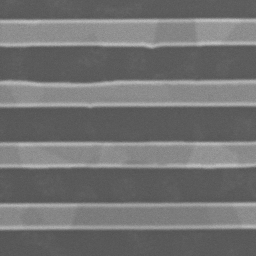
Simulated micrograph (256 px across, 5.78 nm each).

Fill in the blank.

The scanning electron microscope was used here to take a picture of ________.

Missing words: one or a few lines or trenches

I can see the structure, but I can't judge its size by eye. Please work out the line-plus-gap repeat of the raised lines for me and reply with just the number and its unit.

354 nm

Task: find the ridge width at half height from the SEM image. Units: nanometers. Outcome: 132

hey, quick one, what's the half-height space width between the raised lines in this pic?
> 38.4 px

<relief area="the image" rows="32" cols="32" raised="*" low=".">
................................
................................
................................
********************************
********************************
****..*.....*********...........
................................
................................
................................
................................
*****........*******************
********************************
********************************
................................
................................
................................
................................
................................
********************************
********************************
********************************
................................
................................
................................
................................
................................
********************************
********************************
................................
................................
................................
................................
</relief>